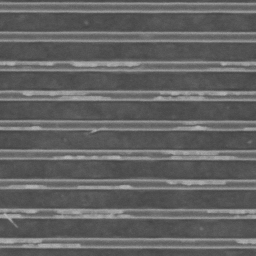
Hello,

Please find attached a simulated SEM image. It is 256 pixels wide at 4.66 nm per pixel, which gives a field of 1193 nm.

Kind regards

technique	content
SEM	parallel lines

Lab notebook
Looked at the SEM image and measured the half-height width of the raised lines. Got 42.5 nm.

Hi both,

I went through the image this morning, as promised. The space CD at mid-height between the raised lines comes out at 20.3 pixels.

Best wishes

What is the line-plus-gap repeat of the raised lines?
137 nanometres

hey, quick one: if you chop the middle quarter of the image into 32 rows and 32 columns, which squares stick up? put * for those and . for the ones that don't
********************************
.****...*****..**..**..*********
................................
................................
................................
................................
................................
********************************
********************************
................................
................................
................................
................................
................................
********************************
********************************
.......**.......................
................................
................................
................................
................................
................................
********************************
********************************
................................
................................
................................
................................
................................
********************************
********************************
................................